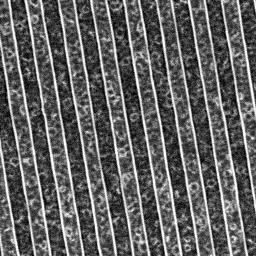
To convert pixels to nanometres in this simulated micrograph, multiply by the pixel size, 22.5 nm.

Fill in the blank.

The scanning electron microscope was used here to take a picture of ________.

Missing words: parallel lines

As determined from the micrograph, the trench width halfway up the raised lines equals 378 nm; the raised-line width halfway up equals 15.9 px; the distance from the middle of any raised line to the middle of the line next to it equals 726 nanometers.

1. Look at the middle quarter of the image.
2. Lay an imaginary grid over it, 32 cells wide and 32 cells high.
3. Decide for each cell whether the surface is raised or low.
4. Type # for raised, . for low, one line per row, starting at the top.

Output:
.####.....###.....####....####..
.####.....####....####....####..
..####....####....####....####..
..####....####....####....####..
..####....####....####....####..
..####....####....####.....###..
..####.....###.....####....####.
..####.....###.....####....####.
...####....####....####....####.
...####....####....####....####.
...####....####....####.....###.
...####....####....####.....###.
...####.....###.....####....####
...####.....###.....####....####
....###.....####....####....####
....###.....####....####....####
....####....####....####.....###
....####....####....####.....###
....####.....###.....####....###
....####.....####....####....###
.....###.....####....####....###
.....###.....####....####....###
#....####....####....####....###
#....####....####....####.....##
#....####.....###.....####....##
#....####.....####....####....##
#.....###.....####....####....##
#.....###.....####....####....##
##....####....####....####.....#
##....####....####....####.....#
##....####....####.....####....#
##....####....#####....####....#